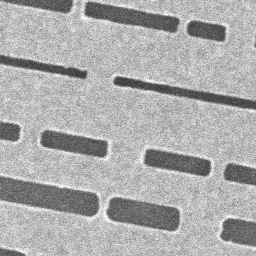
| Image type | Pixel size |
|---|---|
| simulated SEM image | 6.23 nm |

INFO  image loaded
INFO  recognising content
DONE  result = one or a few lines or trenches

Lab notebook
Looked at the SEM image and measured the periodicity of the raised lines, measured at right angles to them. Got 398 nm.